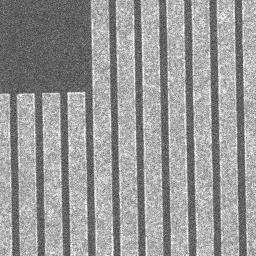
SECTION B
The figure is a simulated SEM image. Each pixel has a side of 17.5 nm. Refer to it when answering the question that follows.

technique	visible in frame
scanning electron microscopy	parallel lines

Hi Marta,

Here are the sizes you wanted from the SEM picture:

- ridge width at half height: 297 nm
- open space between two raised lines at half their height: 140 nanometres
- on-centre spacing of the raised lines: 440 nanometres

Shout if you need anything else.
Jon